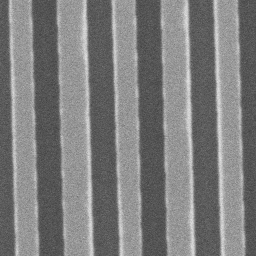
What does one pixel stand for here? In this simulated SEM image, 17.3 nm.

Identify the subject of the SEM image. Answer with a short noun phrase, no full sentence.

lines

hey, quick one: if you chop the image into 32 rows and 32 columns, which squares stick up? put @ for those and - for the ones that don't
-@@@---@@@@---@@@---@@@----@@@--
-@@@---@@@@---@@@---@@@----@@@--
-@@@---@@@@---@@@---@@@----@@@--
-@@@---@@@@---@@@---@@@----@@@--
-@@@---@@@@---@@@---@@@----@@@--
-@@@---@@@@---@@@---@@@@---@@@--
-@@@---@@@@---@@@---@@@@---@@@--
-@@@---@@@@---@@@---@@@@---@@@--
-@@@---@@@@---@@@---@@@@---@@@--
-@@@---@@@@---@@@---@@@@---@@@--
-@@@---@@@@---@@@---@@@@---@@@--
-@@@----@@@---@@@---@@@@---@@@--
--@@----@@@---@@@---@@@@---@@@--
--@@----@@@---@@@----@@@---@@@--
--@@----@@@---@@@----@@@---@@@--
--@@----@@@----@@----@@@---@@@--
--@@----@@@----@@----@@@---@@@--
--@@----@@@----@@----@@@---@@@--
--@@----@@@----@@----@@@---@@@--
--@@----@@@----@@----@@@---@@@--
--@@----@@@----@@----@@@---@@@--
--@@@---@@@----@@----@@@---@@@--
--@@@---@@@----@@----@@@---@@@--
--@@@---@@@----@@----@@@---@@@--
--@@@---@@@----@@@---@@@---@@@--
--@@@---@@@----@@@---@@@----@@--
--@@@---@@@----@@@---@@@----@@--
--@@@---@@@@---@@@---@@@----@@--
--@@@---@@@@---@@@---@@@----@@--
--@@@---@@@@---@@@---@@@----@@@-
--@@@---@@@@---@@@---@@@----@@@-
--@@@---@@@@---@@@---@@@----@@@-